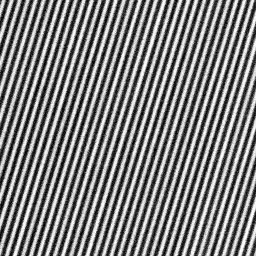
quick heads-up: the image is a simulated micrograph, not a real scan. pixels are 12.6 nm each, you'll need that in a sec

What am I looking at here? parallel lines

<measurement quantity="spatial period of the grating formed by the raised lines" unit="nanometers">96.9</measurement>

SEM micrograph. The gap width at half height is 54.4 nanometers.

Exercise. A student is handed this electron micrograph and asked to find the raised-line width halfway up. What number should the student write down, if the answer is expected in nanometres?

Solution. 43.8